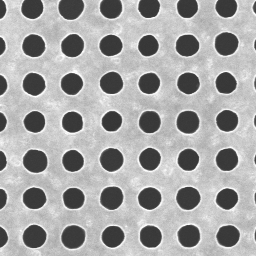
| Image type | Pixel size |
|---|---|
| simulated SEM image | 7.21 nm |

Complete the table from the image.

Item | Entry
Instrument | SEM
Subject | a regular array of holes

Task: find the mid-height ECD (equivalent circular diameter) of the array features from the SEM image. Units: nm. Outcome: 160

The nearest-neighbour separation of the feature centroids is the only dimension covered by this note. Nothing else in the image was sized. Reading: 272 nm